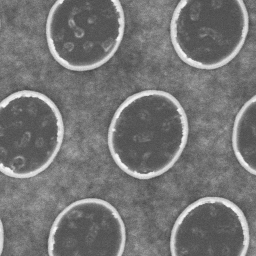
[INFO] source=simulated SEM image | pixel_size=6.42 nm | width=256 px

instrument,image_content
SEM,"raised bodies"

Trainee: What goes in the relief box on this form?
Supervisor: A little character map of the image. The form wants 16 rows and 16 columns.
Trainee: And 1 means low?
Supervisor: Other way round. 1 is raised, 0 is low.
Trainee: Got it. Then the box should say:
0001111100011110
0001111100011110
0001111100011110
0001111000011110
0000000000000000
0000000000000000
1110000011100001
1111000111110001
1111000111110001
1110000111100001
1110000011000001
0000000000000000
0000000000000100
0000111000011110
0001111100011110
0001111100011110